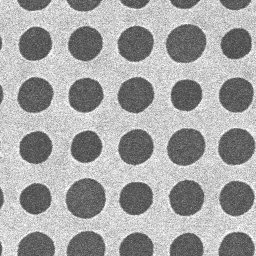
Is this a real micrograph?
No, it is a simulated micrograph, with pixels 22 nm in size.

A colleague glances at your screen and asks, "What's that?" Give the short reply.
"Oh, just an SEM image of a regular array of holes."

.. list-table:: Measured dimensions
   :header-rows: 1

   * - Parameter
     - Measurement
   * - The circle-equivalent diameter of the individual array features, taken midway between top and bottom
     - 784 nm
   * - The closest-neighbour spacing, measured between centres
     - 1100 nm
